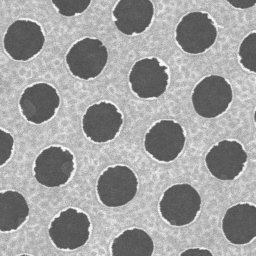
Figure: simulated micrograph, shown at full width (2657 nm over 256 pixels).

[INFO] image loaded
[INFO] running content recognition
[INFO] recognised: a regular array of holes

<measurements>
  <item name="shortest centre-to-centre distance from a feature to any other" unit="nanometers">666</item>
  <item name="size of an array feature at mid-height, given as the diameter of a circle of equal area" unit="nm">418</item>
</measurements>